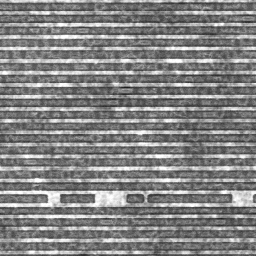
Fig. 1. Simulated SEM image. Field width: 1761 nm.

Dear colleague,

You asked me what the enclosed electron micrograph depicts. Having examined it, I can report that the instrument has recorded parallel lines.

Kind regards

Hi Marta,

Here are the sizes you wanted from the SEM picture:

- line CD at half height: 23.2 nm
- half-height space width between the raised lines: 63.6 nanometres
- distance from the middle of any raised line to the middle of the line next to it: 82.4 nm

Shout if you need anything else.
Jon